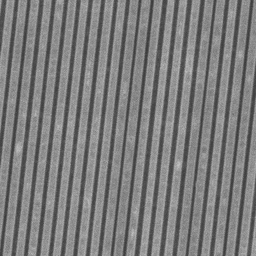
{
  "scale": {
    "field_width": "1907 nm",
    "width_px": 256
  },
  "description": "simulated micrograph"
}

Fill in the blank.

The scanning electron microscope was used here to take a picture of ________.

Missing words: parallel lines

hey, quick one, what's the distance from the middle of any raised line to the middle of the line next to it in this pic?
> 91.7 nanometers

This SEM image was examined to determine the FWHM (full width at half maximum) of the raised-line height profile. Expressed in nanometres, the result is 57.3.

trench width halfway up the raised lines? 37.9 nanometers